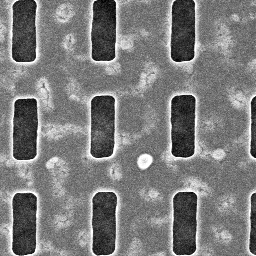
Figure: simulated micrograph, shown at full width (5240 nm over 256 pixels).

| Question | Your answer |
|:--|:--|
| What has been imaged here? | holes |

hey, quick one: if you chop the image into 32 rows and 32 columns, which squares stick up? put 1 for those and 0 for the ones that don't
11000111111100111111110011111111
10000111111100011111100011111111
10000111111100011111100011111111
10000111111000011111100011111111
10000111111000011111100011111111
10000111111000011111100011111111
10000111111000011111100011111111
11001111111100111111110011111111
11111111111111111111111111111111
11111111111111111111111111111111
11111111111111111111111111111111
11111111111111111111111111111111
11001111111100111111100011111110
11000111111000111111100001111110
11000111111000111111100001111110
11000111111000111111100011111110
11000111111000111111100011111110
11000111111000111111100011111110
11000111111000111111100011111110
11001111111100111111110011111111
11111111111111111111111111111111
11111111111111111111111111111111
11111111111111111111111111111111
11111111111111111111111111111111
11001111111100011111110001111110
10000111111000011111110001111110
11000111111000111111110001111110
11000111111000011111110001111110
11000111111000011111110001111110
10000111111000111111110001111110
10000111111000011111110001111110
11001111111100111111110011111110